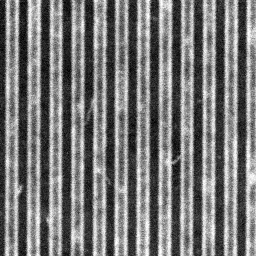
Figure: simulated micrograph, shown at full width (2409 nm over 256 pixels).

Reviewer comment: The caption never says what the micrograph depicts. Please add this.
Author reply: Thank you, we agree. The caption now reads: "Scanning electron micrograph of parallel lines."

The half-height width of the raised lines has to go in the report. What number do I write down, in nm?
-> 95.2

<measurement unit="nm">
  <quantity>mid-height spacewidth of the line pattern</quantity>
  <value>110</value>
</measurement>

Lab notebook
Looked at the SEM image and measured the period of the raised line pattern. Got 0.206 um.